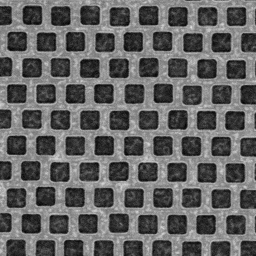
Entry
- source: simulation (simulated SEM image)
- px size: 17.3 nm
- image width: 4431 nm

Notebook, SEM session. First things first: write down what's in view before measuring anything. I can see a regular array of holes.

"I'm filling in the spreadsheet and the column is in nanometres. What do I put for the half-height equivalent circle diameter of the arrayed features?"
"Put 386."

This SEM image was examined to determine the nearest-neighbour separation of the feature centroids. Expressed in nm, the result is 498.